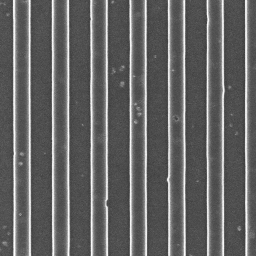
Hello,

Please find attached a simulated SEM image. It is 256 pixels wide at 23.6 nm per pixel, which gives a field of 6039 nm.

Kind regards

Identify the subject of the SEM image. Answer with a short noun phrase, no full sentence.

parallel lines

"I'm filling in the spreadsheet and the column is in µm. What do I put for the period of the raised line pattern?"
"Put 0.912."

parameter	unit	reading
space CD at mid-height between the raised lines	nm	531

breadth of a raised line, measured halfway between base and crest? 380 nanometers